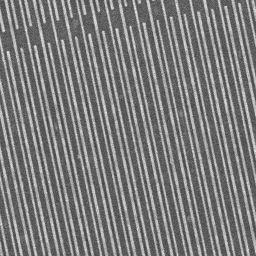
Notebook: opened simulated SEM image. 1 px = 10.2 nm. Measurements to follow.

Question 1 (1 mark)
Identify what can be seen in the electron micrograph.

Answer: parallel lines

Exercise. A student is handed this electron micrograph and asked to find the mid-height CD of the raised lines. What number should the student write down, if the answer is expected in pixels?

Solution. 2.45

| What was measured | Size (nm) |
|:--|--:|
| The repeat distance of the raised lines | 70.8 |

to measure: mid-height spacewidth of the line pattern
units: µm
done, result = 0.0349